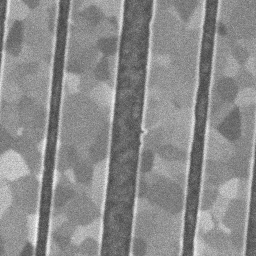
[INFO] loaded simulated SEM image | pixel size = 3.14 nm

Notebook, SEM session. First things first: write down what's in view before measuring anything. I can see one or a few lines or trenches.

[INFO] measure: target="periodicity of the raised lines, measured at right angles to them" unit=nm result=234